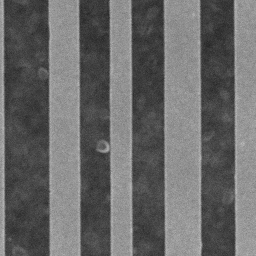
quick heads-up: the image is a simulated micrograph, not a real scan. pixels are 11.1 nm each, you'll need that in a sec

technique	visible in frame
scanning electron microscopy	one or a few lines or trenches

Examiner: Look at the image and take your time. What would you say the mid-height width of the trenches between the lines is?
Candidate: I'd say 378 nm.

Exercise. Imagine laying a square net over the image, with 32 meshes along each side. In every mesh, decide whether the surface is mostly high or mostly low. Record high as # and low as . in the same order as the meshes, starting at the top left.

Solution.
......####....##.....####....###
......####....##.....####....###
......####....##.....####....###
......####....##.....####....###
......####....##.....####....###
......####....##.....####....###
......####....##.....####....###
......####....##.....####....###
......####....##.....####....###
.....#####....##.....####....###
......####....##.....####.....##
......####....##.....####.....##
......####....##.....####.....##
......####....##.....####.....##
......####....##.....####.....##
......####....##.....####.....##
......####....##.....####.....##
......####....##.....####.....##
......####..####.....####....###
......####....##.....####.....##
......####....##.....####....###
......####....##.....####....###
......####....##.....####....###
......####....##.....####....###
......####....##.....####...####
......####....##.....####.....##
......####....##.....####.....##
......####....##.....####.....##
......####....##.....####.....##
......####....##.....####.....##
......####....##.....####.....##
..#...####....##.....####.....##